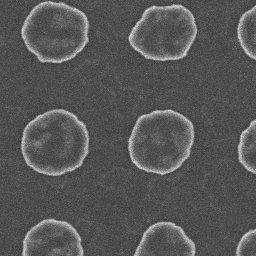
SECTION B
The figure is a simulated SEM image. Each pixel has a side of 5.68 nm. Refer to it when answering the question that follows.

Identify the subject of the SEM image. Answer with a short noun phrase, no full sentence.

raised bodies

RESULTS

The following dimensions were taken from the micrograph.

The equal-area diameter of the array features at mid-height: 357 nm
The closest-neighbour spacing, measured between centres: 0.61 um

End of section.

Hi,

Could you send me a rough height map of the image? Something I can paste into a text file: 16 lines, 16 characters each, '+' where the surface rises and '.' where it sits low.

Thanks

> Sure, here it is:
..++.....++.....
..+++....+++...+
..+++...++++...+
..+++....++.....
................
................
................
..+++....+++....
.++++...++++...+
.++++...++++...+
..+++....++....+
................
................
................
..+++....++.....
..+++....+++...+